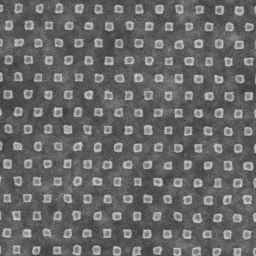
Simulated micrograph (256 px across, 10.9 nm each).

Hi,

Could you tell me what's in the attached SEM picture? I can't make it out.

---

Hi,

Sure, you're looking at a regular array of raised bodies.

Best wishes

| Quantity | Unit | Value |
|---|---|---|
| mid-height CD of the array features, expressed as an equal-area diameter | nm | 92.7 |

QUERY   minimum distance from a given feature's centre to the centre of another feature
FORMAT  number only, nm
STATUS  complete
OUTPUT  210